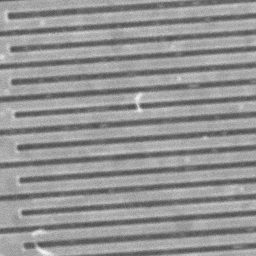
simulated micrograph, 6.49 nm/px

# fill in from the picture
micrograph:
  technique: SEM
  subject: parallel lines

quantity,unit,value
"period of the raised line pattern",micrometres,0.106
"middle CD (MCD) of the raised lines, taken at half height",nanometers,60.7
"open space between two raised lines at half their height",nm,48.5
